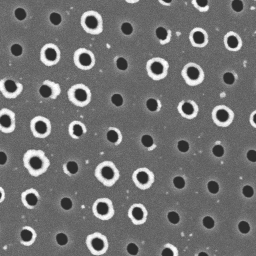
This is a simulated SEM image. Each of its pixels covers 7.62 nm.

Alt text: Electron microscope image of a regular array of holes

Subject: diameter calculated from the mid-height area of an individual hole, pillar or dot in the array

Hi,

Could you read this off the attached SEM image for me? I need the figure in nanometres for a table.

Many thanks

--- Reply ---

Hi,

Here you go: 93.4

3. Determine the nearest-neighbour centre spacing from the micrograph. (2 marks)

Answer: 269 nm